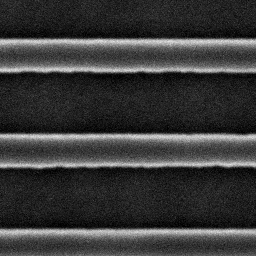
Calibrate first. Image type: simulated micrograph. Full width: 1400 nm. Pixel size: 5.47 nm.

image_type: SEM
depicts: lines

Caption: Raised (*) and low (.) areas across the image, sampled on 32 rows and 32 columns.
................................
................................
................................
................................
................................
********************************
********************************
********************************
********************************
................................
................................
................................
................................
................................
................................
................................
................................
********************************
********************************
********************************
********************************
................................
................................
................................
................................
................................
................................
................................
................................
********************************
********************************
********************************